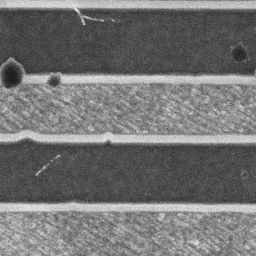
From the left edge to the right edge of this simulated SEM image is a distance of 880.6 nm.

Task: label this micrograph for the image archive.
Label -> one or a few lines or trenches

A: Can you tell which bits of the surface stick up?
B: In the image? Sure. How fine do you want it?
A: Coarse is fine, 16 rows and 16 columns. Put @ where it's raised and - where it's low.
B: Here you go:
----------------
----------------
----------------
----------------
@@--------------
@@@@@@@@@@@@@@@@
@@@@@@@@@@@@@@@@
@@@@@@@@@@@@@@@@
@-@@@@@@@@@@@@@@
----------------
----------------
----------------
----------------
@@@@@@@@@@@@@@@@
@@@@@@@@@@@@@@@@
@@@@@@@@@@@@@@@@